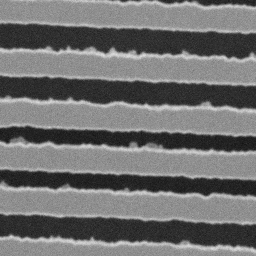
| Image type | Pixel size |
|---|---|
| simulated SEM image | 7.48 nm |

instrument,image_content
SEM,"lines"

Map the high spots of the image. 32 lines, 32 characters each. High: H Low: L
HHHHHHHHHHHHHHHHHHHHHLHHHLLLLLLL
HHHHHHHHHHHHHHHHHHHHHHHHHHHHHHHH
HHHHHHHHHHHHHHHHHHHHHHHHHHHHHHHH
LLLLLLLLLLLLLLHLLHHHHHHHHHHHHHHH
LLLLLLLLLLLLLLLLLLLLLLLLLLLLLLLL
LLLLLLLLLLLLLLLLLLLLLLLLLLLLLLLL
HHHHHHHHHHHHLLLLLLLLLLLLLLLLLLLL
HHHHHHHHHHHHHHHHHHHHHHHHHHHHHHHH
HHHHHHHHHHHHHHHHHHHHHHHHHHHHHHHH
LHHHHHHHHHHHHHHHHHHHHHHHHHHHHHHH
LLLLLLLLLLLLLLLLLLLLLLLLLLHHHHHH
LLLLLLLLLLLLLLLLLLLLLLLLLLLLLLLL
HHHHLLLLLLLLLLLLLLLLLLLLLLLLLLLL
HHHHHHHHHHHHHHHHHHHHHHHHHHHHHHLL
HHHHHHHHHHHHHHHHHHHHHHHHHHHHHHHH
HHHHHHHHHHHHHHHHHHHHHHHHHHHHHHHH
LLLLLLLLLLLLLLLLLLLHHHHHHHHHHHHH
LLLLLLLLLLLLLLLLLLLLLLLLLLLLLLLL
HHHHHHHHHHHHHHHHHHHLLLLLLLLLLLLL
HHHHHHHHHHHHHHHHHHHHHHHHHHHHHHHH
HHHHHHHHHHHHHHHHHHHHHHHHHHHHHHHH
LLLLLLHLLHHHHHHHHHHHHHHHHHHHHHHH
LLLLLLLLLLLLLLLLLLLLLLLLLLLLLLLH
HHHHHHLLHLLLLLLLLLLLLLLLLLLLLLLL
HHHHHHHHHHHHHHHHHHHHHHHHHHHHHLLL
HHHHHHHHHHHHHHHHHHHHHHHHHHHHHHHH
HHHHHHHHHHHHHHHHHHHHHHHHHHHHHHHH
LLLLLLLLLLLLLLLLLLHHHLLHHHHHHHHH
LLLLLLLLLLLLLLLLLLLLLLLLLLLLLLLL
LHLLLLLLLLLLLLLLLLLLLLLLLLLLLLLL
HHHHHHHHHHHHHHHHHHHHHHLLLLLLLLLL
HHHHHHHHHHHHHHHHHHHHHHHHHHHHHHHH